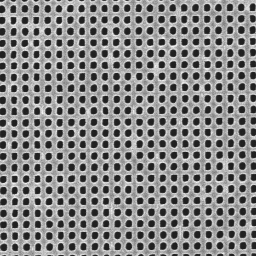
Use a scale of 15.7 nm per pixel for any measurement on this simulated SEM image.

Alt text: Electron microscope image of a regular array of holes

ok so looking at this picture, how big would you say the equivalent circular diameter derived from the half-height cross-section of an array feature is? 115 nanometers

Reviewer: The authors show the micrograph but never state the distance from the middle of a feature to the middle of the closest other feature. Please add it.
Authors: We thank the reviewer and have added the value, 175 nm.